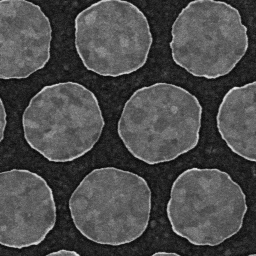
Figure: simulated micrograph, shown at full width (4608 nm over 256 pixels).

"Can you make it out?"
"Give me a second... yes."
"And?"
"raised bodies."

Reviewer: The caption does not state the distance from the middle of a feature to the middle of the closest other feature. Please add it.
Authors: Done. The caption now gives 1720 nanometres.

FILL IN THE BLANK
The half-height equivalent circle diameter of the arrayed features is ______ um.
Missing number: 1.42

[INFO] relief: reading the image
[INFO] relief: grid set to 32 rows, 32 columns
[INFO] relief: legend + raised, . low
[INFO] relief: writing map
++++........++++........++++....
+++++.....+++++++......+++++++..
++++++....++++++++....++++++++..
++++++...++++++++++...+++++++++.
++++++...++++++++++...+++++++++.
++++++...++++++++++..++++++++++.
++++++....++++++++....+++++++++.
++++++....++++++++....++++++++..
+++++......++++++......++++++...
+++.......................+.....
.......+++.........++..........+
.....++++++......++++++......+++
....++++++++....+++++++++...++++
...+++++++++....+++++++++...++++
+..++++++++++..++++++++++..+++++
+..++++++++++..++++++++++..+++++
...++++++++++..++++++++++...++++
...+++++++++...++++++++++...++++
....+++++++.....++++++++.....+++
......++++.......+++++........++
................................
.+++.......+++++.......+++++....
+++++.....++++++++....+++++++...
++++++....+++++++++...++++++++..
+++++++..++++++++++..++++++++++.
+++++++..++++++++++..++++++++++.
+++++++..++++++++++..++++++++++.
+++++++..++++++++++..+++++++++..
+++++++...++++++++....++++++++..
++++++.....++++++......++++++...
++++.........++.........+++.....
.......++.......................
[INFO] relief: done